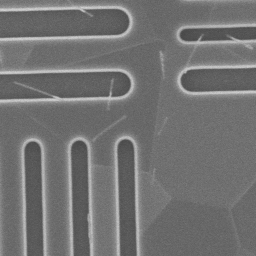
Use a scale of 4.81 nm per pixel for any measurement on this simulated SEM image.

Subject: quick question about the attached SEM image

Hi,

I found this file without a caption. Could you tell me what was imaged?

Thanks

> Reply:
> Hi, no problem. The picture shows groups of lines, slits or small figures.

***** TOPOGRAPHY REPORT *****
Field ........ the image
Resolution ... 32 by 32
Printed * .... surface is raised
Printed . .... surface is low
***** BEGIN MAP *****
********************************
................****************
................****************
................*******.........
..............********..........
********************************
********************************
********************************
************************........
................*******.........
.................******.........
................*******.........
.....***************************
********************************
********************************
********************************
********************************
*********.*****.****************
***..****..****..***************
***..****..****..***************
***..****..****..***************
***..****..****..***************
***..****..****..***************
***..****..****..***************
***..****..****..***************
***..****..****..***************
***..****..****..***************
***...***..****..***************
***...***..****..***************
***...***..****..***************
***...***..****..***************
***...***..****..***************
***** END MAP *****